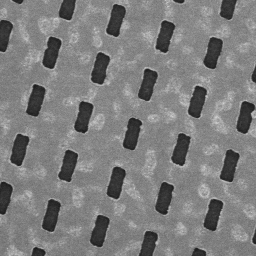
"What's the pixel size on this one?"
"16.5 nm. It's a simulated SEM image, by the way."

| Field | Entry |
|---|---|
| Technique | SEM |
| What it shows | a regular array of holes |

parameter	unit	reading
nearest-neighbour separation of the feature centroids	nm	838